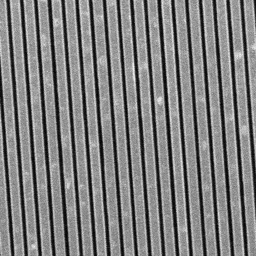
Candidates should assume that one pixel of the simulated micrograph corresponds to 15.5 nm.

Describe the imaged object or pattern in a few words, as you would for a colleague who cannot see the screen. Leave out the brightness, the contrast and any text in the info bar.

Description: parallel lines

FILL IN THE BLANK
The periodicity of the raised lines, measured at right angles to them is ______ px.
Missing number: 13.7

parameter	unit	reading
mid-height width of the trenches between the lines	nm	67.7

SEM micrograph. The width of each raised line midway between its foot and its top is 136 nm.